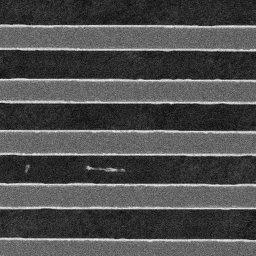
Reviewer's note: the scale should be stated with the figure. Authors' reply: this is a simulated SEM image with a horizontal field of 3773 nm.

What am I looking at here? lines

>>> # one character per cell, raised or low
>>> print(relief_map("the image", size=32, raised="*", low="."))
................................
................................
................................
********************************
********************************
********************************
................................
................................
................................
................................
********************************
********************************
********************************
................................
................................
................................
********************************
********************************
********************************
................................
................................
................................
................................
********************************
********************************
********************************
................................
................................
................................
................................
********************************
********************************